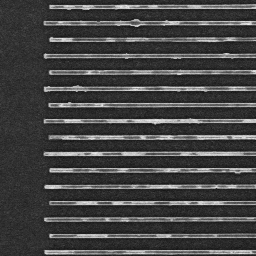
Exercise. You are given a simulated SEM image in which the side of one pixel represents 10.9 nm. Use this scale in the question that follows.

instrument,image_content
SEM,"parallel lines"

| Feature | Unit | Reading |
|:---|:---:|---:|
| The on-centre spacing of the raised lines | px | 16.3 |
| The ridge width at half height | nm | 32.6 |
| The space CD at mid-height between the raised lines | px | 13.5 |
